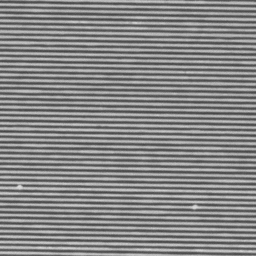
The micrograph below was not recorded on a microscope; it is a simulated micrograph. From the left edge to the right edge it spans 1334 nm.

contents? parallel lines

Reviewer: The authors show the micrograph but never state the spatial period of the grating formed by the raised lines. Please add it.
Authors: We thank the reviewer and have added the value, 28.1 nm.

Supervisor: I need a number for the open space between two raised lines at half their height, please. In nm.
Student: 15.6